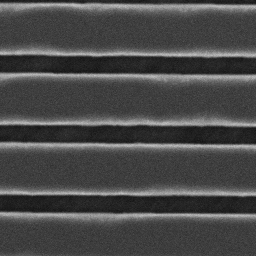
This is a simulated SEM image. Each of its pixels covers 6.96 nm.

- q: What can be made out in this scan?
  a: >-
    lines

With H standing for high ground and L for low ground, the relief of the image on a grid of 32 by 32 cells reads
HHHLHHHHHHLHLLLLLLLLLLLLLLLLLLLL
HHHHHHHHHHHHHHHHHHHHHHHHHHHHHHHH
HHHHHHHHHHHHHHHHHHHHHHHHHHHHHHHH
HHHHHHHHHHHHHHHHHHHHHHHHHHHHHHHH
HHHHHHHHHHHHHHHHHHHHHHHHHHHHHHHH
HHHHHHHHHHHHHHHHHHHHHHHHHHHHHHHH
HHHHHHHHHHHHHHHHHHHHHHHHHHHHHHHH
LLLLLLLLLLLLLLLLLLLLLLLLLLLLLLLL
LLLLLLLLLLLLLLLLLLLLLLLLLLLLLLLL
HHHHHHHHHHHHHHHHHHHHHHHHHHHHHHHH
HHHHHHHHHHHHHHHHHHHHHHHHHHHHHHHH
HHHHHHHHHHHHHHHHHHHHHHHHHHHHHHHH
HHHHHHHHHHHHHHHHHHHHHHHHHHHHHHHH
HHHHHHHHHHHHHHHHHHHHHHHHHHHHHHHH
HHHHHHHHHHHHHHHHHHHHHHHHHHHHHHHH
HHHHHHHHHHHHHHHHHHHHHHHHHHHHHHHH
LLLLLLLLLLLLLLLLLLLLLLLLLLLLLLLL
LLLLLLLLLLLLLLLLLLLLLLLLLLLLLLLL
HHHHHHHHHHHHHHHHHHHHHHHHHHHHHHHH
HHHHHHHHHHHHHHHHHHHHHHHHHHHHHHHH
HHHHHHHHHHHHHHHHHHHHHHHHHHHHHHHH
HHHHHHHHHHHHHHHHHHHHHHHHHHHHHHHH
HHHHHHHHHHHHHHHHHHHHHHHHHHHHHHHH
HHHHHHHHHHHHHHHHHHHHHHHHHHHHHHHH
LLLLLLLLLLLLLLLLLLLLLLLLLLLLLLHL
LLLLLLLLLLLLLLLLLLLLLLLLLLLLLLLL
LLLLLLLLLLLLLLLLLLLLLLLLLLLLLLLL
HHHHHHHHHHHHHHHHHHHHHHHHHHHHHHHH
HHHHHHHHHHHHHHHHHHHHHHHHHHHHHHHH
HHHHHHHHHHHHHHHHHHHHHHHHHHHHHHHH
HHHHHHHHHHHHHHHHHHHHHHHHHHHHHHHH
HHHHHHHHHHHHHHHHHHHHHHHHHHHHHHHH